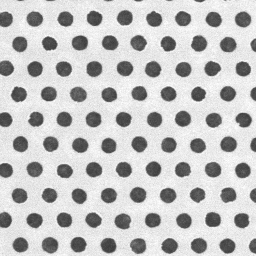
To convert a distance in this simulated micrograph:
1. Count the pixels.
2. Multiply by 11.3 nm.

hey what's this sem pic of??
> a regular array of holes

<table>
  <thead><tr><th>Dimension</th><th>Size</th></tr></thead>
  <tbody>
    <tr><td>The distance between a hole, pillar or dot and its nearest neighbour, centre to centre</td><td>323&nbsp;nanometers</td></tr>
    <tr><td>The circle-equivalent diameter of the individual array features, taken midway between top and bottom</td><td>177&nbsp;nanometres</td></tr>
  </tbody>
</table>